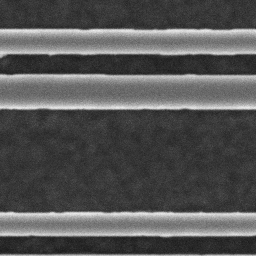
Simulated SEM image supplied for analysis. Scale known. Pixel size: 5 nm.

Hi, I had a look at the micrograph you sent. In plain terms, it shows lines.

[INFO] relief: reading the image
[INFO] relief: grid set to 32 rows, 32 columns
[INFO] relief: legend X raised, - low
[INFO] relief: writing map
--------------------------------
--------------------------------
--------------------------------
--------------------------------
XXXXXXXXXXXXXXXXXXXXXXXXXXXXXXXX
XXXXXXXXXXXXXXXXXXXXXXXXXXXXXXXX
XXXXXXXXXXXXXXXXXXXXXXXXXXXXXXXX
--------------------------------
--------------------------------
XXXXXXXXXXXXXXXXXXXXXXXXXXXXXXXX
XXXXXXXXXXXXXXXXXXXXXXXXXXXXXXXX
XXXXXXXXXXXXXXXXXXXXXXXXXXXXXXXX
XXXXXXXXXXXXXXXXXXXXXXXXXXXXXXXX
XXXXX-XXXXXXXXXXXXXXXXXXXXXXXXXX
--------------------------------
--------------------------------
--------------------------------
--------------------------------
--------------------------------
--------------------------------
--------------------------------
--------------------------------
--------------------------------
--------------------------------
--------------------------------
--------------------------------
--------------------------------
XXXXXXXXXXXXXXXXXXXXXXXXXXXXXXXX
XXXXXXXXXXXXXXXXXXXXXXXXXXXXXXXX
--------------------XX----------
--------------------------------
--------------------------------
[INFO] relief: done